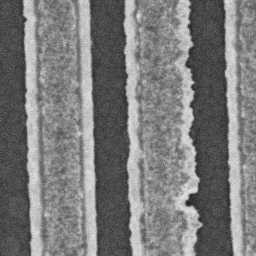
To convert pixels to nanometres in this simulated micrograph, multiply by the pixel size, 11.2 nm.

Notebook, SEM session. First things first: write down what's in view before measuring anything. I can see one or a few lines or trenches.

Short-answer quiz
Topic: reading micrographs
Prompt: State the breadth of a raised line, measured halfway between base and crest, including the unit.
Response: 55.6 px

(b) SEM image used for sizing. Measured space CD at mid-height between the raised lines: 498 nanometres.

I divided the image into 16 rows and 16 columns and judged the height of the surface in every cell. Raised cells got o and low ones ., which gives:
..ooo...oooo..oo
..ooo...oooo..oo
..ooo...oooo..oo
..ooo...oooo..oo
..ooo...oooo..oo
..ooo...oooo...o
..ooo...oooo...o
..ooo...oooo...o
..oooo..oooo...o
..oooo..oooo...o
..oooo..oooo...o
..oooo..oooo...o
..oooo..ooo....o
..oooo..oooo...o
..oooo..oooo...o
..oooo...ooo...o